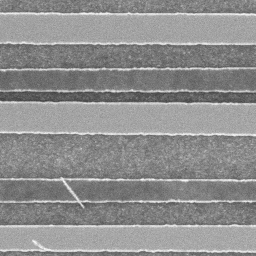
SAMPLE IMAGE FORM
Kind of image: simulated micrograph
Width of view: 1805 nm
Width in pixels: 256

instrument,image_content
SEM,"lines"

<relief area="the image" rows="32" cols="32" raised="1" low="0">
00000000000000000000000000000000
00000000000000000000000000000000
11111111111111111111111111111111
11111111111111111111111111111111
11111111111111111111111111111111
00001110000111101100111111111111
00000000000000000000000000000000
00000000000000000000000000000000
00000000000000000000000000000000
11111111111111111111111111111111
11111111111111111111111111111111
00000000000000000000000000000000
00000000000000000000000000000000
11111111111111111111111111111111
11111111111111111111111111111111
11111111111111111111111111111111
11111111111111111111111111111111
00000000000000000000000000000000
00000000000000000000000000000000
00000000000000000000000000000000
00000000000000000000000000000000
00000000000000000000000000000000
11111111111111110111000000000000
11111111111111111111111111111111
11111111111111111111111111111111
00000000000000000000000000000000
00000000000000000000000000000000
00000000000000000000000000000000
11111111111111111111111111111111
11111111111111111111111111111111
11111111111111111111111111111111
00000000000000000000000000110111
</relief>